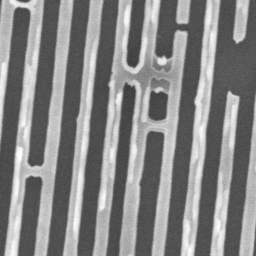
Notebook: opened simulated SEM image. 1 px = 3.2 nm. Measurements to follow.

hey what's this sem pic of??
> parallel lines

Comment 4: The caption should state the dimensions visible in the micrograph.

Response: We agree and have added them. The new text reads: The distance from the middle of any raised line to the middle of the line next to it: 0.0932 micrometres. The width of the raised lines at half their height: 38.9 nm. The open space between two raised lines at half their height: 54 nm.